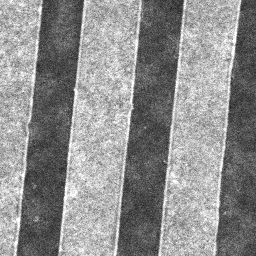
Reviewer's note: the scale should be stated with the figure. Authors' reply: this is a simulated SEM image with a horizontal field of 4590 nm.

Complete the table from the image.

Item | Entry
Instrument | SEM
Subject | one or a few lines or trenches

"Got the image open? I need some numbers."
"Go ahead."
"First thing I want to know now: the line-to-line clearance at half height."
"0.773 micrometres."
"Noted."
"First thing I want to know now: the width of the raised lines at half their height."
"992 nanometers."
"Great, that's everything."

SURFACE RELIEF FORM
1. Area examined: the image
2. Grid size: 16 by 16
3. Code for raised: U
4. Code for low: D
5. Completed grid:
UUUDDUUUUDDDUUUD
UUDDDUUUUDDUUUUD
UUDDDUUUUDDUUUUD
UUDDDUUUDDDUUUUD
UUDDDUUUDDDUUUDD
UUDDDUUUDDDUUUDD
UUDDDUUUDDDUUUDD
UUDDDUUUDDDUUUDD
UUDDUUUUDDDUUUDD
UUDDUUUUDDDUUUDD
UUDDUUUUDDUUUUDD
UDDDUUUUDDUUUUDD
UDDDUUUUDDUUUUDD
UDDDUUUDDDUUUUDD
UDDDUUUDDDUUUDDD
UDDDUUUDDDUUUDDD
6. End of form